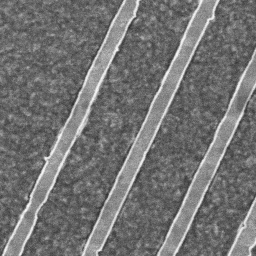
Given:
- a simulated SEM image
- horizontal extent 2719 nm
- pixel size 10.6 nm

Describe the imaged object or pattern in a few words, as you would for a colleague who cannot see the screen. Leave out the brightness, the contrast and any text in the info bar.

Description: one or a few lines or trenches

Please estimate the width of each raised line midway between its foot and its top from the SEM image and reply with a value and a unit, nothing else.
154 nanometres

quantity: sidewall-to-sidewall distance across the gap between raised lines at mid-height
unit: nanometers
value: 590